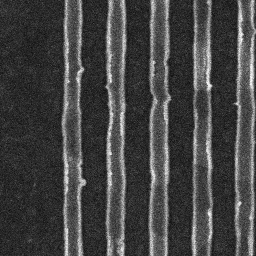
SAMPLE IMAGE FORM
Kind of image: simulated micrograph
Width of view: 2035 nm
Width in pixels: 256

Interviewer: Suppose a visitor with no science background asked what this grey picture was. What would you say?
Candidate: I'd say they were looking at parallel lines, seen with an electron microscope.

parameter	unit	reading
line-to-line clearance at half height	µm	0.216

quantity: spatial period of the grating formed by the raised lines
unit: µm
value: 0.343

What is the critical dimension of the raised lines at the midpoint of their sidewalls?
123 nanometers